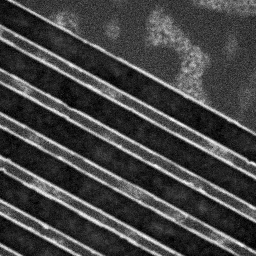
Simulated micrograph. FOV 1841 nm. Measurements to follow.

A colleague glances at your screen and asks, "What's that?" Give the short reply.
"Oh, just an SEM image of parallel lines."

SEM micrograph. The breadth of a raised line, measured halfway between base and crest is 85.3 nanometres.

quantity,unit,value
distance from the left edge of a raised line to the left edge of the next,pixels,38.3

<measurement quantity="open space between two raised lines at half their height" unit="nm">190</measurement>